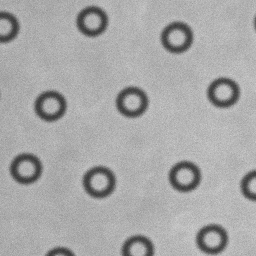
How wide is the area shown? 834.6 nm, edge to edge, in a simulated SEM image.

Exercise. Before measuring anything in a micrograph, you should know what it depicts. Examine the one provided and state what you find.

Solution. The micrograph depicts a regular array of ring-shaped grooves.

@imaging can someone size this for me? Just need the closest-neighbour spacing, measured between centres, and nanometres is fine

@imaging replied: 235